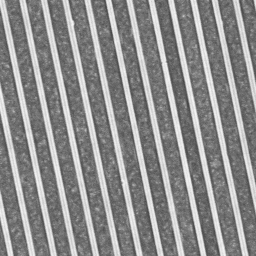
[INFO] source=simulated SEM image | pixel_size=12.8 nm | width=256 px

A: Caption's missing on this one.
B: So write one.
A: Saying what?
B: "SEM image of parallel lines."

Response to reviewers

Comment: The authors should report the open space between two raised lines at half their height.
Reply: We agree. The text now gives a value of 205 nm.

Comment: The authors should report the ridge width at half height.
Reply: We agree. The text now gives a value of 0.0626 microns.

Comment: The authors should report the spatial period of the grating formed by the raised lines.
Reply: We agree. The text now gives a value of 267 nanometres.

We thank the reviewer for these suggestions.